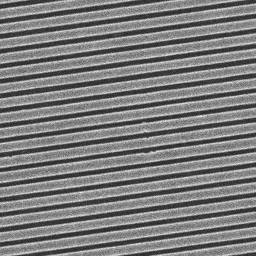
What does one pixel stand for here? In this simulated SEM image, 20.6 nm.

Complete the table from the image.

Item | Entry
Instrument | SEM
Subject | parallel lines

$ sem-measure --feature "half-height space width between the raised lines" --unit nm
115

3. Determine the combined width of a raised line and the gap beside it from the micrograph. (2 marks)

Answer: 304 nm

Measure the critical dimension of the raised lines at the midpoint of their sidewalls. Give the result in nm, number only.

191